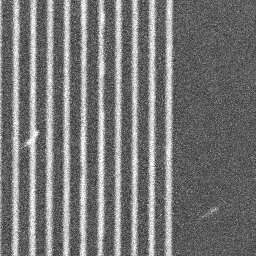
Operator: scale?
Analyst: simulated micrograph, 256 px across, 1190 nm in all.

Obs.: parallel lines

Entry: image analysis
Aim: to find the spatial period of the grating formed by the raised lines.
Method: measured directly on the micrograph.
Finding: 79.2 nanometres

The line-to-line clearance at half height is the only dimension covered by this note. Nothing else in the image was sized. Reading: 0.0611 micrometres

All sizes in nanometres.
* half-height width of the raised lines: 17.4